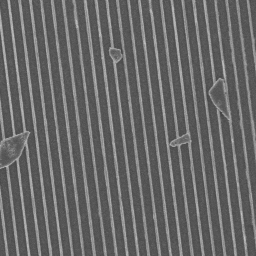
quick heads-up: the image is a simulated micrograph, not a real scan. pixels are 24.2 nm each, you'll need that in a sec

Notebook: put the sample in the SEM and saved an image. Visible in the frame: parallel lines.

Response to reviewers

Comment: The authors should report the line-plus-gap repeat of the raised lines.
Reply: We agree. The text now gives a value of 0.262 micrometres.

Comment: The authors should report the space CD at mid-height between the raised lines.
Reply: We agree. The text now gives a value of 216 nanometres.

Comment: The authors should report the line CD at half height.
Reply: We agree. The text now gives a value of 45 nm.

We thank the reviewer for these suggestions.